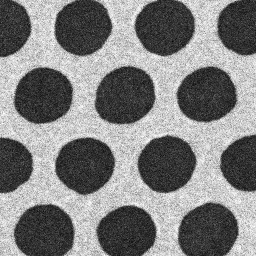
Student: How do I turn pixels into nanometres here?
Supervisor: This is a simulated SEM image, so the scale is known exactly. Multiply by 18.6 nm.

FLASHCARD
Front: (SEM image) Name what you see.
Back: holes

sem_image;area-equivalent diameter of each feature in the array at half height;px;57.8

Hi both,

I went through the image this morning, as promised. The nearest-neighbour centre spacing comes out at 1.48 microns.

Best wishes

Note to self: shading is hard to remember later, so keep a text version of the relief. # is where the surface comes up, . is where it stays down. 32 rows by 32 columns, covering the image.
..#######....######....######...
...####......####.......####....
....###.......###.......###.....
....###.......###.......###.....
....###.......###.......###.....
...####......#####.....#####....
..######....#######...#######...
################################
####..#########..########..#####
###.....#####......####......###
##.......###.......####......###
##.......###.......###........##
##.......###.......###........##
##.......###.......###.......###
###.....#####.....#####.....####
###############.################
################################
..#######...#######....#######..
...#####......####......####....
....###.......###.......####....
....###.......###.......####....
....###.......###.......####....
....####......####......####....
..#######....######....######...
################################
##########################.#####
###.....######....######.....###
##.......####......####.......##
##.......###.......###........##
##.......###........##........##
##.......###.......###.......###
###.....#####.....#####......###